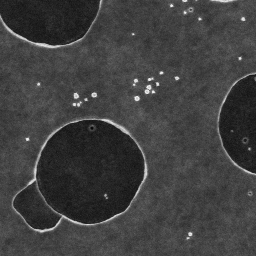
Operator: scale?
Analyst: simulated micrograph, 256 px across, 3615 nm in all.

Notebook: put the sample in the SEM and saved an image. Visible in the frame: holes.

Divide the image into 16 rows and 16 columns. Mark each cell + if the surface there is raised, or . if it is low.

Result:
......++++++++++
......++++++++++
++...+++++++++++
++++++++++++++++
++++++++++++++++
+++++++++++++++.
++++++++++++++..
++++++++++++++..
+++.....++++++..
+++......+++++..
++.......++++++.
++.......+++++++
+.......++++++++
+......+++++++++
++++++++++++++++
++++++++++++++++